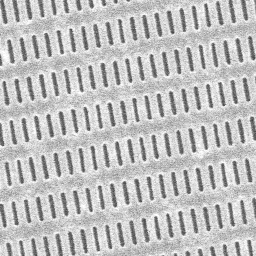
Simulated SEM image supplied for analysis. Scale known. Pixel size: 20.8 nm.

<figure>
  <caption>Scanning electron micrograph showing a regular array of holes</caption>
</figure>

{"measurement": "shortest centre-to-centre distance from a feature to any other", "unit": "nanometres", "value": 258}